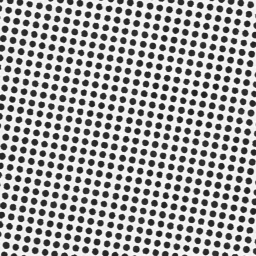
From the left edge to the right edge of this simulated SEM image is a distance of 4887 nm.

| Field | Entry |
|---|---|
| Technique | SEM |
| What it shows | a regular array of holes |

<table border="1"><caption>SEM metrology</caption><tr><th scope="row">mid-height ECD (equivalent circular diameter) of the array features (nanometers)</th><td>134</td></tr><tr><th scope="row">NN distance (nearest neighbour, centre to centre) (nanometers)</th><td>182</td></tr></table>